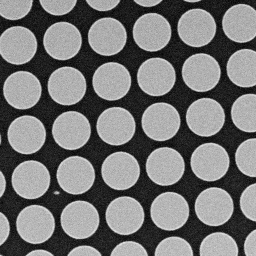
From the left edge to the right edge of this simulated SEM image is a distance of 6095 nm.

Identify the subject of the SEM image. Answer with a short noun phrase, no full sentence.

an array of small figures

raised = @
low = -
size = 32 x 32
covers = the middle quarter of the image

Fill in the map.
---------@@@@@@----@@@@@@@@---@@
@@@-----@@@@@@@@---@@@@@@@@@--@@
@@@@----@@@@@@@@--@@@@@@@@@@--@@
@@@@@--@@@@@@@@@@-@@@@@@@@@@--@@
@@@@@--@@@@@@@@@@--@@@@@@@@@--@@
@@@@@--@@@@@@@@@---@@@@@@@@----@
@@@@@---@@@@@@@@----@@@@@@------
@@@@@---@@@@@@@------@@@@-------
@@@@------@@@@------------------
@@@-----------------------------
----------------------@@@@@-----
----------@@@@@------@@@@@@@---@
@@@@-----@@@@@@@@---@@@@@@@@@--@
@@@@@----@@@@@@@@---@@@@@@@@@--@
@@@@@@--@@@@@@@@@@--@@@@@@@@@--@
@@@@@@--@@@@@@@@@@--@@@@@@@@@--@
@@@@@@@-@@@@@@@@@@--@@@@@@@@@---
@@@@@@---@@@@@@@@----@@@@@@@----
@@@@@@---@@@@@@@@-----@@@@------
@@@@@@----@@@@@@----------------
@@@@----------------------------
-----------------------@@@@@----
------------@@@@------@@@@@@@---
-@@@@------@@@@@@@---@@@@@@@@---
@@@@@@----@@@@@@@@---@@@@@@@@@--
@@@@@@@---@@@@@@@@@--@@@@@@@@@--
@@@@@@@---@@@@@@@@@--@@@@@@@@@--
@@@@@@@---@@@@@@@@@--@@@@@@@@@--
@@@@@@@@--@@@@@@@@----@@@@@@@---
@@@@@@@----@@@@@@@-----@@@@@----
@@@@@@@----@@@@@@---------------
@@@@@@--------------------------